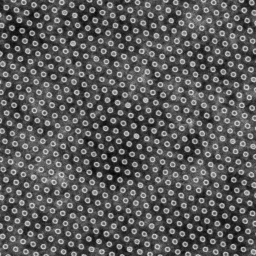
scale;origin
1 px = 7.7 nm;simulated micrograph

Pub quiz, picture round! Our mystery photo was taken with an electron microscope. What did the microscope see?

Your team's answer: a regular array of raised bodies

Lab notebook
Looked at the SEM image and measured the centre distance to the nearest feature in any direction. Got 79.6 nm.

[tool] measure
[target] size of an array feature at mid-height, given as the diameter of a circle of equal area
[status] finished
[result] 0.0379 um